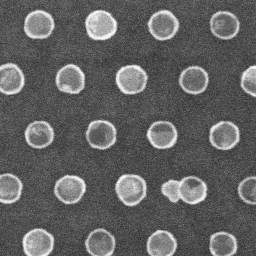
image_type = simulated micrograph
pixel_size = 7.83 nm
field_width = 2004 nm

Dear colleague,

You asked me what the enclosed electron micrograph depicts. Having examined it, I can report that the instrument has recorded a regular array of raised bodies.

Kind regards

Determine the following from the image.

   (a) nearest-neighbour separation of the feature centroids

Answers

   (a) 61.4 px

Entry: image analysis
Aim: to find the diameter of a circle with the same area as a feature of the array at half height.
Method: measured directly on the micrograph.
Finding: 0.212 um